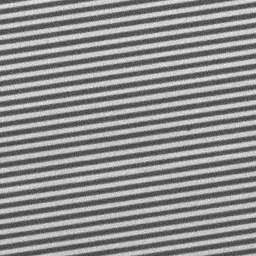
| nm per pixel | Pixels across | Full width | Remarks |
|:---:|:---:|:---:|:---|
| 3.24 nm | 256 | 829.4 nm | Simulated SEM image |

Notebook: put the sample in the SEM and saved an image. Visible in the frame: parallel lines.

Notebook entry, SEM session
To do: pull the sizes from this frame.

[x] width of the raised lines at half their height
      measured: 0.0156 micrometres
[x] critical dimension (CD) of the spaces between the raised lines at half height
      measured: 0.0188 micrometres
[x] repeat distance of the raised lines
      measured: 32.9 nanometres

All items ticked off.